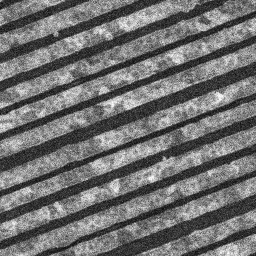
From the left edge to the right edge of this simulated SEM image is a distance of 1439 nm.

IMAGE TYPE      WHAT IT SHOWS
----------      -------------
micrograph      parallel lines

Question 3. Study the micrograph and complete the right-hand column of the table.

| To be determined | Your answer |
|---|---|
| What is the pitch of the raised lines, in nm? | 140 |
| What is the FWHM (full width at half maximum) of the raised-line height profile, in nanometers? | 87.9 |